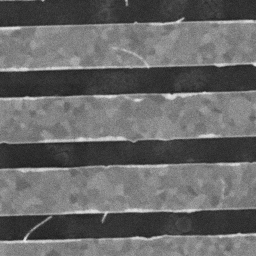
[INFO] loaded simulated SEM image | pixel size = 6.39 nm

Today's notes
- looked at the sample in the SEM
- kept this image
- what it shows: one or a few lines or trenches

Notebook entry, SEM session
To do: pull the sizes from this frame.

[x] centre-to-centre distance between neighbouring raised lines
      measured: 0.457 microns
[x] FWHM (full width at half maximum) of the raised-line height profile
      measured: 287 nm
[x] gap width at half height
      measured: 168 nanometers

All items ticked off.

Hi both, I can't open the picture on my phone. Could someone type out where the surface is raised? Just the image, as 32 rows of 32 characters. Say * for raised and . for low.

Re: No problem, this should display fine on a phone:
................................
................................
................................
.*******************************
********************************
********************************
********************************
********************************
************....................
................................
................................
.............................***
********************************
********************************
********************************
********************************
********************************
*****************...............
................................
................................
..........................******
********************************
********************************
********************************
********************************
********************************
****************.......*........
................................
................................
....................**.....*****
********************************
********************************